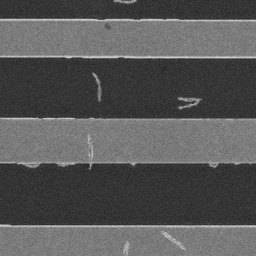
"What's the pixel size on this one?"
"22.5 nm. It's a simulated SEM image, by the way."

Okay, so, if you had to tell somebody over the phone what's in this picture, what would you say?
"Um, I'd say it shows lines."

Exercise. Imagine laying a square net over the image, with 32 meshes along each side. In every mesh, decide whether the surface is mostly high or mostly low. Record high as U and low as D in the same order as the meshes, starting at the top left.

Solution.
DDDDDDDDDDDDDDDDDDDDDDDDDDDDDDDD
DDDDDDDDDDDDDDDDDDDDDDDDDDDDDDDD
UUUUUUUUUUUUDDDDDDDDDDDDDDDDDDDD
UUUUUUUUUUUUUUUUUUUUUUUUUUUUUUUU
UUUUUUUUUUUUUUUUUUUUUUUUUUUUUUUU
UUUUUUUUUUUUUUUUUUUUUUUUUUUUUUUU
UUUUUUUUUUUUUUUUUUUUUUUUUUUUUUUU
DDDDDDDDDDDDDDDDDDDDDDDDDDDDDDDD
DDDDDDDDDDDDDDDDDDDDDDDDDDDDDDDD
DDDDDDDDDDDDDDDDDDDDDDDDDDDDDDDD
DDDDDDDDDDDDDDDDDDDDDDDDDDDDDDDD
DDDDDDDDDDDDDDDDDDDDDDDDDDDDDDDD
DDDDDDDDDDDDDDDDDDDDDDDDDDDDDDDD
DDDDDDDDDDDDDDDDDDDDDDDDDDDDDDDD
DDDDDDDDDDDDDDDDDDDDDDDDDDDDDDDD
UUUUUUUUUUUUUUUUUUUUUUUUUUUUUUUU
UUUUUUUUUUUUUUUUUUUUUUUUUUUUUUUU
UUUUUUUUUUUUUUUUUUUUUUUUUUUUUUUU
UUUUUUUUUUUUUUUUUUUUUUUUUUUUUUUU
UUUUUUUUUUUUUUUUUUUUUUUUUUUUUUUU
DDDDDDDDDDDDDDDDDDDDDDDDDDDDDDDD
DDDDDDDDDDDDDDDDDDDDDDDDDDDDDDDD
DDDDDDDDDDDDDDDDDDDDDDDDDDDDDDDD
DDDDDDDDDDDDDDDDDDDDDDDDDDDDDDDD
DDDDDDDDDDDDDDDDDDDDDDDDDDDDDDDD
DDDDDDDDDDDDDDDDDDDDDDDDDDDDDDDD
DDDDDDDDDDDDDDDDDDDDDDDDDDDDDDDD
DDDDDDDDDDDDDDDDDDDDDDDDDDDDDDDD
UUUUUUUUUUUUUUUUUUUUUUUUUUUUUUUU
UUUUUUUUUUUUUUUUUUUUUUUUUUUUUUUU
UUUUUUUUUUUUUUUUUUUUUUUUUUUUUUUU
UUUUUUUUUUUUUUUUUUUUUUUUUUUUUUUU